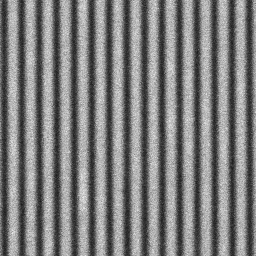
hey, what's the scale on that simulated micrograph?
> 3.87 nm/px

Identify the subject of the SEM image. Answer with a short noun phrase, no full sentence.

parallel lines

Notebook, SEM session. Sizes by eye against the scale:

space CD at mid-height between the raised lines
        29.5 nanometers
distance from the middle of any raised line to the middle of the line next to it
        0.0677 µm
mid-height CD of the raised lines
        10.1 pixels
